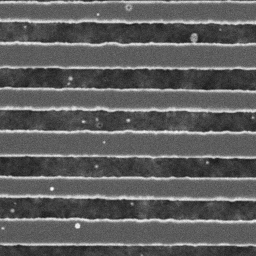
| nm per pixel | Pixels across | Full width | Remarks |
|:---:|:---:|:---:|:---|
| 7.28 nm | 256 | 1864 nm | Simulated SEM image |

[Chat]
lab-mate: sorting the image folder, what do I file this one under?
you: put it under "lines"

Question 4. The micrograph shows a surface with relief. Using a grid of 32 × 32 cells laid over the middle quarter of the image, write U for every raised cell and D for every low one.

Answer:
UUUUUUUUUUUUUUUUUUUUUUUUUUUUUUUU
DDDDDDDDDDDDDDDDDDDDDDDDDDDDDDDD
DDDDDDDDDDDDDDDDDDDDDDDDDDDDDDDD
DDDDDDDDDDDDDDDDDDDDDDDDDDDDDDDD
DDDDDDDDDDDDDDDDDDDDDDDDDDDDDDDD
DDDDDDDDDDDDDDDDDDDDDDDDDDDDDDDD
UUUUUUUUUUUUUUUUUUUUUUUUDUUUUUDD
UUUUUUUUUUUUUUUUUUUUUUUUUUUUUUUU
UUUUUUUUUUUUUUUUUUUUUUUUUUUUUUUU
UUUUUUUUUUUUUUUUUUUUUUUUUUUUUUUU
UUUUUUUUUUUUUUUUUUUUUUUUUUUUUUUU
UDUDUUUUDDUUUUUUUUUUUUUUUUUUUUUU
DDDDDDDDDDDDDDDDDDDDDDDDDDDDDDDD
DDDDDDDDDDDDDDDDDDDDDDDDDDDDDDDD
DDDDDDDDDDDDDDDDDDDDDDDDDDDDDDDD
DDDDDDDDDDDDDDDDDDDDDDDDDDDDDDDD
DDDDDDDDDDDDDDDDDDDDDDDDDDDDDDDD
UUUUUUUUUUUUUUUUUUUUUUUUUUUUUUUU
UUUUUUUUUUUUUUUUUUUUUUUUUUUUUUUU
UUUUUUUUUUUUUUUUUUUUUUUUUUUUUUUU
UUUUUUUUUUUUUUUUUUUUUUUUUUUUUUUU
UUUUUUUUUUUUUUUUUUUUUUUUUUUUUUUU
UUUUUUUUUUUUUUUUUUUUUUUUUUUUUUUU
DDDDDDDDDDDDDDDDDDDDDDUDDDDDDDDD
DDDDDDDDDDDDDDDDDDDDDDDDDDDDDDDD
DDDDDDDDDDDDDDDDDDDDDDDDDDDDDDDD
DDDDDDDDDDDDDDDDDDDDDDDDDDDDDDDD
DDDDDDDDDDDDDDDDDDDDDDDDDDDDDDDD
UUUUUDUDDUUUUDUUUUUUDUUDDDUUDDDU
UUUUUUUUUUUUUUUUUUUUUUUUUUUUUUUU
UUUUUUUUUUUUUUUUUUUUUUUUUUUUUUUU
UUUUUUUUUUUUUUUUUUUUUUUUUUUUUUUU